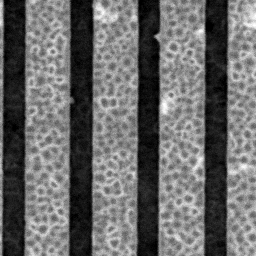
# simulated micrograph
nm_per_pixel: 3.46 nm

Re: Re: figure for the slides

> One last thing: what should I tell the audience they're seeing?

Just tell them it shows one or a few lines or trenches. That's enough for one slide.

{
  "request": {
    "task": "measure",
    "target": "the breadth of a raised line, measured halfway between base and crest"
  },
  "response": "154 nanometers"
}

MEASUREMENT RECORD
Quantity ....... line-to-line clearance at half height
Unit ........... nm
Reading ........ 80.4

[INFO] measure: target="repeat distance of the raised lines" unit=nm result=232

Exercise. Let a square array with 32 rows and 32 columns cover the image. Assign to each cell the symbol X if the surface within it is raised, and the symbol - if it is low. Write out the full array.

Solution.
---XXXXXX---XXXXX---XXXXXX---XXX
---XXXXXX---XXXXX---XXXXXX---XXX
---XXXXXX---XXXXX---XXXXXX---XXX
---XXXXXX---XXXXX---XXXXXX---XXX
---XXXXXX---XXXXX---XXXXXX---XXX
---XXXXXX---XXXXX---XXXXXX---XXX
---XXXXXX---XXXXX---XXXXXX---XXX
---XXXXXX---XXXXX---XXXXXX---XXX
---XXXXXX---XXXXX---XXXXXX---XXX
---XXXXXX---XXXXX---XXXXXX---XXX
---XXXXXX---XXXXX---XXXXXX---XXX
---XXXXXX---XXXXX---XXXXXX---XXX
---XXXXXX---XXXXX---XXXXXX---XXX
---XXXXXX---XXXXX---XXXXX----XXX
---XXXXXX---XXXXX---XXXXX----XXX
---XXXXXX---XXXXX---XXXXX----XXX
---XXXXXX---XXXXX---XXXXX----XXX
---XXXXXX---XXXXX---XXXXX----XXX
---XXXXXX---XXXXX---XXXXX----XXX
---XXXXXX---XXXXX---XXXXX---XXXX
---XXXXXX---XXXXX---XXXXX---XXXX
---XXXXXX---XXXXX---XXXXX---XXXX
---XXXXXX---XXXXX---XXXXXX--XXXX
---XXXXXX---XXXXX---XXXXX---XXXX
---XXXXXX---XXXXX---XXXXX---XXXX
---XXXXXX---XXXXX---XXXXX---XXXX
---XXXXXX---XXXXX---XXXXX---XXXX
---XXXXXX---XXXXX---XXXXX---XXXX
---XXXXXX---XXXXX---XXXXX---XXXX
---XXXXXX---XXXXX---XXXXX---XXXX
---XXXXXX---XXXXX---XXXXX---XXXX
---XXXXXX---XXXXX---XXXXX---XXXX